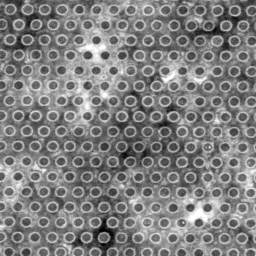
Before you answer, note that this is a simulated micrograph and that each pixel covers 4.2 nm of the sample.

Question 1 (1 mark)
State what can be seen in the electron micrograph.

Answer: a regular array of raised bodies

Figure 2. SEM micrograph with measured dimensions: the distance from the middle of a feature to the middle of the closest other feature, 71.6 nm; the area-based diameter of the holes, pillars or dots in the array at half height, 0.0439 micrometres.